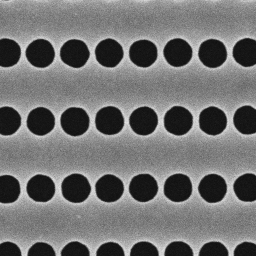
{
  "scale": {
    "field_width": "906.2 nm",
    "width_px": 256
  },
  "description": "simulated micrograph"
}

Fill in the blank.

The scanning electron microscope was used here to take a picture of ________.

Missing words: a regular array of holes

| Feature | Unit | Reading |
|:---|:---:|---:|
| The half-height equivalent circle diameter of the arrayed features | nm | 102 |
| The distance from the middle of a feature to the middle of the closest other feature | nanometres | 121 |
